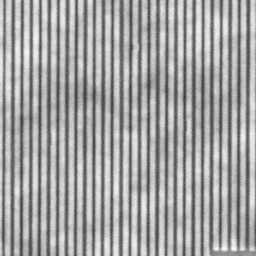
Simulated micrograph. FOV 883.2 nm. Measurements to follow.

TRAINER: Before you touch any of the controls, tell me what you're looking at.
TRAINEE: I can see parallel lines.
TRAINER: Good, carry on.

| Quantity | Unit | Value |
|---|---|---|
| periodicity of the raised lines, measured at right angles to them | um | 0.0312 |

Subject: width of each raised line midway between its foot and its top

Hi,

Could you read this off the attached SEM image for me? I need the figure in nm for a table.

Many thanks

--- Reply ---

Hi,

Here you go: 18.1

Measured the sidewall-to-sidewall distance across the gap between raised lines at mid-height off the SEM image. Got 4.38 pixels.